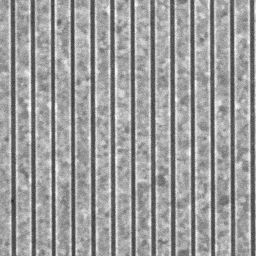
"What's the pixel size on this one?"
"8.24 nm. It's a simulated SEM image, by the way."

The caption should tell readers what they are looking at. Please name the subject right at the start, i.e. parallel lines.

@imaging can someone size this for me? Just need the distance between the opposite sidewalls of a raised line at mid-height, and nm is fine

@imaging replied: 126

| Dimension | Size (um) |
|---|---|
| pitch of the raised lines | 0.164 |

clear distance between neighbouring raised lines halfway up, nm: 42.2